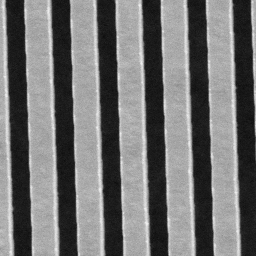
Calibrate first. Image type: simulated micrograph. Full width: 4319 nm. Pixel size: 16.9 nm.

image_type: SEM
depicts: lines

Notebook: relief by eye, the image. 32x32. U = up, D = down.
UDDUUUDDDUUUDDDUUUDDUUUDDDUUUDDU
UDDUUUDDDUUUDDDUUUDDUUUDDDUUUDDU
UDDUUUDDDUUUDDDUUUDDUUUDDDUUUDDU
UDDUUUDDDUUUDDDUUUDDUUUDDDUUUDDD
UDDUUUDDDUUUDDDUUUDDUUUDDDUUUDDD
UDDUUUUDDUUUDDDUUUDDUUUDDDUUUDDD
UDDUUUUDDUUUDDDUUUDDUUUDDDUUUDDD
UDDUUUUDDUUUDDDUUUDDUUUDDDUUUDDD
UDDUUUUDDUUUDDDUUUDDUUUUDDUUUDDD
UDDUUUUDDUUUDDDUUUDDUUUUDDUUUDDD
UDDUUUUDDUUUDDDUUUDDUUUUDDUUUDDD
UDDUUUUDDUUUDDDUUUDDDUUUDDUUUDDD
UDDUUUUDDUUUDDDUUUDDDUUUDDUUUDDD
UDDUUUUDDUUUDDDUUUDDDUUUDDUUUDDD
UDDDUUUDDUUUDDDUUUDDDUUUDDUUUDDD
UDDDUUUDDUUUDDDUUUDDDUUUDDUUUDDD
UDDDUUUDDUUUUDDUUUDDDUUUDDUUUDDD
UDDDUUUDDUUUUDDUUUDDDUUUDDUUUUDD
UDDDUUUDDUUUUDDUUUDDDUUUDDUUUUDD
UDDDUUUDDUUUUDDUUUDDDUUUDDUUUUDD
UDDDUUUDDUUUUDDUUUDDDUUUDDUUUUDD
UDDDUUUDDUUUUDDUUUDDDUUUDDDUUUDD
UDDDUUUDDUUUUDDUUUDDDUUUDDDUUUDD
UDDDUUUDDUUUUDDUUUDDDUUUDDDUUUDD
UDDDUUUDDDUUUDDUUUDDDUUUDDDUUUDD
UDDDUUUDDDUUUDDUUUDDDUUUDDDUUUDD
UDDDUUUDDDUUUDDUUUUDDUUUDDDUUUDD
UDDDUUUDDDUUUDDUUUUDDUUUDDDUUUDD
UDDDUUUDDDUUUDDUUUUDDUUUDDDUUUDD
UUDDUUUDDDUUUDDUUUUDDUUUDDDUUUDD
UUDDUUUDDDUUUDDUUUUDDUUUDDDUUUDD
UUDDUUUDDDUUUDDUUUUDDUUUDDDUUUDD